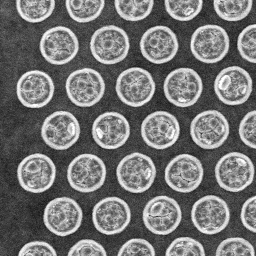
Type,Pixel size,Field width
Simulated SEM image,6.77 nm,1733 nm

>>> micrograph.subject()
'a regular array of raised bodies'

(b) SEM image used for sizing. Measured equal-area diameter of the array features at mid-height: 236 nanometers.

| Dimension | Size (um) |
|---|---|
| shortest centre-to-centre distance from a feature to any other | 0.327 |